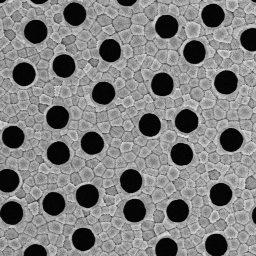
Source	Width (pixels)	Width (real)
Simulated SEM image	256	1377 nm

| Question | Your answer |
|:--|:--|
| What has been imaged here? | a regular array of holes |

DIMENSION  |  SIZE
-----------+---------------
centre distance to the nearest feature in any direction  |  220 nanometers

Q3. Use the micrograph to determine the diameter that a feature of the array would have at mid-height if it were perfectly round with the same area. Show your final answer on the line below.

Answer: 123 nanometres